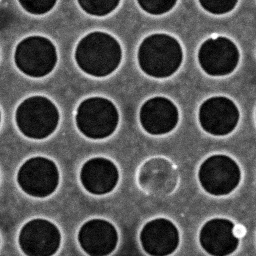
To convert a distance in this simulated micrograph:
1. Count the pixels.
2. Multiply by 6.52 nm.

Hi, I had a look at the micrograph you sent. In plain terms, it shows a regular array of holes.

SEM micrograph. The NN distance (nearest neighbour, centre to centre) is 385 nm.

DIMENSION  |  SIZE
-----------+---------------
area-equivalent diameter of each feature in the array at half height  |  276 nm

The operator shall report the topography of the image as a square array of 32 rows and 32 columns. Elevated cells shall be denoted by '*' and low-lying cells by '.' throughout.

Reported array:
**.....***.....**.....***.....**
***...*****...****...*****...***
********************************
********************************
****.******...****....**********
**.....***.....**.....***....***
**.....**......**......**.....**
**.....**......**......**.....**
**.....***.....***....***.....**
***...******.******..*****..****
********************************
********************************
***...****....*****..*****...***
**.....***.....***....***.....**
**.....**......**.....***.....**
**.....***.....***....***.....**
***....***....****...*****...***
********************************
********************************
**************************..****
***....***....***********.....**
**.....***.....**********.....**
**.....***.....**********.....**
***....***....***********....***
****..**************************
********************************
********************************
****..*****..******..*****..****
***....***....****....***....***
**......**.....**.....***....***
**......**.....***....***.....**
***....****...****....****...***